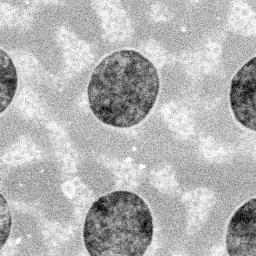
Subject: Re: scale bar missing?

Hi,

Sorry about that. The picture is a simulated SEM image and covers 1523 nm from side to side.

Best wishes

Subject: holes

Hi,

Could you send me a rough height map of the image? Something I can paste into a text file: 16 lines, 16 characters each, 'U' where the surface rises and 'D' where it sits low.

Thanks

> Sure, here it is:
UUUUUUUUUUUUUUUU
UUUUUUUUUUUUUUUU
UUUUUUUUUUUUUUUU
DUUUUUUDDUUUUUUU
DUUUUUDDDDUUUUUD
DUUUUUDDDDUUUUDD
DUUUUUDDDDUUUUDD
UUUUUUDDDUUUUUUD
UUUUUUUUUUUUUUUU
UUUUUUUUUUUUUUUU
UUUUUUUUUUUUUUUU
UUUUUUUUUUUUUUUU
UUUUUUDDDUUUUUUU
DUUUUDDDDUUUUUUD
DUUUUDDDDDUUUUDD
UUUUUDDDDUUUUUDD